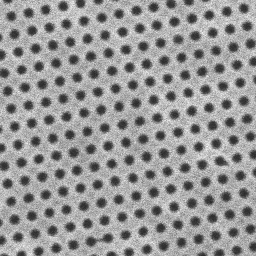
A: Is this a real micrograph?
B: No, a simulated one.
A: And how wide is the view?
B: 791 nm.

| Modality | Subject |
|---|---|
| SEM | a regular array of holes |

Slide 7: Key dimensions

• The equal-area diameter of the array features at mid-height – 32.6 nm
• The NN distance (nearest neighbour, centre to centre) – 54.2 nanometres